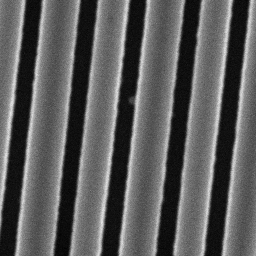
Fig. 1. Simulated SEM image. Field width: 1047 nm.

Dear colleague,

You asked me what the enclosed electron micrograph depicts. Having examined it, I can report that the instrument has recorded lines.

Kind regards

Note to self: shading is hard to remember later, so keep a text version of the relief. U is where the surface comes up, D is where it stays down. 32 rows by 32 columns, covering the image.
UUUDDUUUUUDDUUUUDDUUUUUDDUUUUDDU
UUUDDUUUUUDDUUUUDDUUUUUDDUUUUDDU
UUUDDUUUUUDDUUUUDDUUUUUDDUUUUDDU
UUUDDUUUUUDDUUUUDDUUUUUDDUUUUDDU
UUUDDUUUUUDDUUUUDDUUUUUDDUUUUDDU
UUUDDUUUUDDDUUUDDDUUUUDDDUUUDDDU
UUDDDUUUUDDDUUUDDDUUUUDDUUUUDDDU
UUDDDUUUUDDUUUUDDDUUUUDDUUUUDDUU
UUDDUUUUUDDUUUUDDUUUUUDDUUUUDDUU
UUDDUUUUUDDUUUUDDUUUUUDDUUUUDDUU
UUDDUUUUUDDUUUUDDUUUUUDDUUUUDDUU
UUDDUUUUUDDUUUUDDUUUUUDDUUUUDDUU
UUDDUUUUUDDUUUUDDUUUUUDDUUUUDDUU
UUDDUUUUUDDUUUUDDUUUUDDDUUUUDDUU
UUDDUUUUUDDUUUUDDUUUUDDDUUUDDDUU
UDDDUUUUDDDUUUDDDUUUUDDUUUUDDDUU
UDDDUUUUDDDUUUDDDUUUUDDUUUUDDDUU
UDDUUUUUDDUUUUDDUUUUUDDUUUUDDUUU
UDDUUUUUDDUUUUDDUUUUUDDUUUUDDUUU
UDDUUUUUDDUUUUDDUUUUUDDUUUUDDUUU
UDDUUUUUDDUUUUDDUUUUUDDUUUUDDUUU
UDDUUUUUDDUUUUDDUUUUUDDUUUUDDUUU
UDDUUUUUDDUUUUDDUUUUUDDUUUUDDUUU
UDDUUUUUDDUUUUDDUUUUDDDUUUDDDUUU
DDDUUUUDDDUUUDDDUUUUDDDUUUDDDUUU
DDDUUUUDDUUUUDDDUUUUDDUUUUDDUUUU
DDDUUUUDDUUUUDDUUUUUDDUUUUDDUUUU
DDUUUUUDDUUUUDDUUUUUDDUUUUDDUUUU
DDUUUUUDDUUUUDDUUUUUDDUUUUDDUUUU
DDUUUUUDDUUUUDDUUUUUDDUUUUDDUUUU
DDUUUUUDDUUUUDDUUUUUDDUUUUDDUUUU
DDUUUUUDDUUUUDDUUUUUDDUUUUDDUUUU